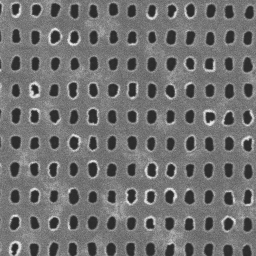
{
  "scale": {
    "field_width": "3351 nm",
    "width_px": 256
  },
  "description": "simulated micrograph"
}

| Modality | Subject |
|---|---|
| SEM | a regular array of holes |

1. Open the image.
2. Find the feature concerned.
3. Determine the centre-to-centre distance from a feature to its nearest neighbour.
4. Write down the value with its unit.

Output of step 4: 250 nm